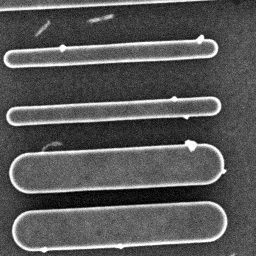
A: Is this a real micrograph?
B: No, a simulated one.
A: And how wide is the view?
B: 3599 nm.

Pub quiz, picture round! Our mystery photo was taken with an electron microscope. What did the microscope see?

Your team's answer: groups of lines, slits or small figures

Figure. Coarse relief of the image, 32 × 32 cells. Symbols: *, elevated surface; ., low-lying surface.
***************.................
................................
................................
................................
................................
...............************.....
.**************************.....
.********************...........
................................
................................
................................
................................
.....................******.....
..*************************.....
.***********************........
..*.............................
................................
................................
.................**********.....
...*************************....
..**************************....
.***************************....
.**************************.....
..**************................
................................
.....................******.....
...*************************....
..**************************....
..**************************....
..*************************.....
..******************............
................................